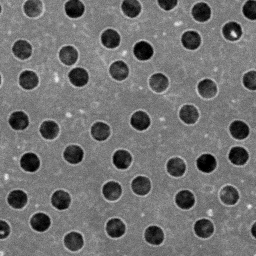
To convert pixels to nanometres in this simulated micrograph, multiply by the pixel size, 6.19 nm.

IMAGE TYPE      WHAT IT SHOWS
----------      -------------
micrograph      a regular array of holes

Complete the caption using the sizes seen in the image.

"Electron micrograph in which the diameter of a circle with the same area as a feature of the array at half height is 130 nm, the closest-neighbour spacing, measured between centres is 0.194 um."